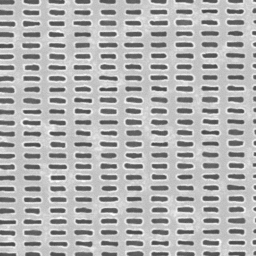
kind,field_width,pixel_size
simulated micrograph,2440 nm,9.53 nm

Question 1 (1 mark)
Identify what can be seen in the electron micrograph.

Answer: a regular array of holes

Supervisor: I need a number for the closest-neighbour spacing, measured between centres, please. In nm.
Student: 104